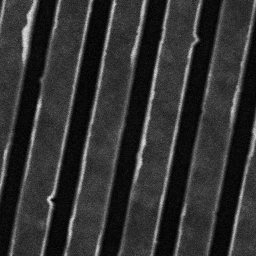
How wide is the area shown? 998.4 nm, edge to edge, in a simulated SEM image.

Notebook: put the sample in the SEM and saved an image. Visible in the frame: parallel lines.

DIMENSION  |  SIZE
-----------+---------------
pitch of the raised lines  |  211 nanometers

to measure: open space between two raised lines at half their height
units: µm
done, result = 0.077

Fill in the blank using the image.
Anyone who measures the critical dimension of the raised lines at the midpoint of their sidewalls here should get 132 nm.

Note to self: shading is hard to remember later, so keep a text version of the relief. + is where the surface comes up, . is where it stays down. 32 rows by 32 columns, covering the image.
+++++..+++++..++++...++++...++++
++++...++++...++++...++++...++++
++++...++++...++++..+++++..+++++
++++...++++..+++++..+++++..+++++
++++..+++++..+++++..+++++..++++.
++++..+++++..++++...++++...++++.
++++..++++...++++...++++...++++.
+++...++++...++++...++++..+++++.
+++...++++...++++..+++++..+++++.
+++..+++++..+++++..+++++..++++..
+++..+++++..++++...++++...++++..
+++..++++...++++...++++...++++..
++...++++...++++...++++..+++++..
++...++++...++++..+++++..+++++..
++..+++++..+++++..+++++..++++...
++..+++++..+++++..++++...++++...
++..++++...++++...++++...++++...
+...++++...++++...++++...++++..+
+...++++..+++++..+++++..+++++..+
+..+++++..+++++..+++++..++++...+
+..+++++..++++...++++...++++...+
+..++++...++++...++++...++++...+
...++++...++++...++++...++++..++
...++++...++++..+++++..+++++..++
..+++++..+++++..+++++..++++...++
..+++++..+++++..++++...++++...++
..+++++..++++...++++...++++...++
..++++...++++...++++...++++..+++
..++++...++++...++++..+++++..+++
..++++..+++++..+++++..+++++..+++
.+++++..+++++..+++++..++++...+++
.+++++..++++...++++...++++...+++